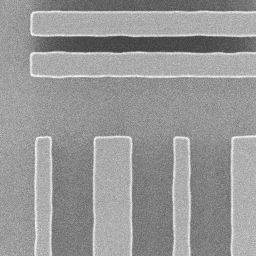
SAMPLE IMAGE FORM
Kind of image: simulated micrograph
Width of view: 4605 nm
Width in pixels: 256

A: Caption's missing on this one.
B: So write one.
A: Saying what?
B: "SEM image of groups of lines, slits or small figures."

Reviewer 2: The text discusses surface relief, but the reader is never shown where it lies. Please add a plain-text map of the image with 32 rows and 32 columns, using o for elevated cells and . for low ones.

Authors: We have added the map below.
................................
......oooo...........oo.ooo.....
....oooooooooooooooooooooooooooo
....oooooooooooooooooooooooooooo
............o...oooo.........oo.
................................
................................
....oooooooooooooooooooooooooooo
....oooooooooooooooooooooooooooo
....oooooooooooooooooooooooooooo
................................
................................
................................
................................
................................
................................
................................
.....o......oooo......o......ooo
....oo......oooo......oo.....ooo
....oo......oooo......oo.....ooo
....oo......oooo......oo.....ooo
....oo......oooo......oo.....ooo
....oo......oooo......oo.....ooo
....oo......oooo......oo.....ooo
....oo......oooo......oo.....ooo
....oo......oooo......oo.....ooo
....ooo.....oooo......oo.....ooo
....oo......oooo......oo.....ooo
....oo......oooo......oo.....ooo
.....o......oooo......oo.....ooo
....oo......oooo......oo.....ooo
....oo......oooo......oo.....ooo